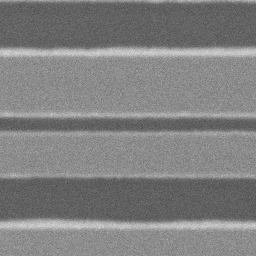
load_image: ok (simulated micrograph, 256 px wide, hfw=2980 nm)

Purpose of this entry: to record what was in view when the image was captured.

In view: lines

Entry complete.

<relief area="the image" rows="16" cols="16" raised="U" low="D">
DDDDDDDDDDDDDDDD
DDDDDDDDDDDDDDDD
DDDDDDDDDDDDDDDD
UUUUUUUUUUUUUUUU
UUUUUUUUUUUUUUUU
UUUUUUUUUUUUUUUU
UUUUUUUUUUUUUUUU
UUUUUUUUUUUUUUUU
UUUUUUUUUUUUUUUU
UUUUUUUUUUUUUUUU
UUUUUUUUUUUUUUUU
DDDDDDDDDDDDDDDD
DDDDDDDDDDDDDDDD
DDDDDDDDDDDDDDDD
UUUUUUUUUUUUUUUU
UUUUUUUUUUUUUUUU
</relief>